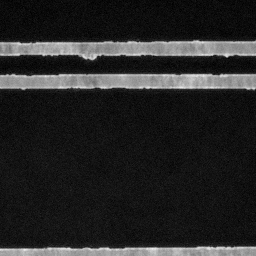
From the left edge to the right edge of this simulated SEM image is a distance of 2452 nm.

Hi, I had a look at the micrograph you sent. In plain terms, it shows lines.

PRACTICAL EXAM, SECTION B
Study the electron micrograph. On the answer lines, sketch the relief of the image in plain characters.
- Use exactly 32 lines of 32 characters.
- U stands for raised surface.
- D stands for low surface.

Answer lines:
DDDDDDDDDDDDDDDDDDDDDDDDDDDDDDDD
DDDDDDDDDDDDDDDDDDDDDDDDDDDDDDDD
DDDDDDDDDDDDDDDDDDDDDDDDDDDDDDDD
DDDDDDDDDDDDDDDDDDDDDDDDDDDDDDDD
DDDDDDDDDDDDDDDDDDDDDDDDDDDDDDDD
UUUUUUUUUUUUUUUUUUUUUUUUUUUUUUUU
UUUUUUUUUUUUUUUUUUUUUUUUUUUUUUUU
DDDDDDDDDDDDDDDDDDDDDDDDDDDDDDDD
DDDDDDDDDDDDDDDDDDDDDDDDDDDDDDDD
UUUUUUUUUUUUUUUUUUUUUUUUUUUUUUUU
UUUUUUUUUUUUUUUUUUUUUUUUUUUUUUUU
DDDDDDDDDDDDDDDDDDDDDDDDDDDDDDDD
DDDDDDDDDDDDDDDDDDDDDDDDDDDDDDDD
DDDDDDDDDDDDDDDDDDDDDDDDDDDDDDDD
DDDDDDDDDDDDDDDDDDDDDDDDDDDDDDDD
DDDDDDDDDDDDDDDDDDDDDDDDDDDDDDDD
DDDDDDDDDDDDDDDDDDDDDDDDDDDDDDDD
DDDDDDDDDDDDDDDDDDDDDDDDDDDDDDDD
DDDDDDDDDDDDDDDDDDDDDDDDDDDDDDDD
DDDDDDDDDDDDDDDDDDDDDDDDDDDDDDDD
DDDDDDDDDDDDDDDDDDDDDDDDDDDDDDDD
DDDDDDDDDDDDDDDDDDDDDDDDDDDDDDDD
DDDDDDDDDDDDDDDDDDDDDDDDDDDDDDDD
DDDDDDDDDDDDDDDDDDDDDDDDDDDDDDDD
DDDDDDDDDDDDDDDDDDDDDDDDDDDDDDDD
DDDDDDDDDDDDDDDDDDDDDDDDDDDDDDDD
DDDDDDDDDDDDDDDDDDDDDDDDDDDDDDDD
DDDDDDDDDDDDDDDDDDDDDDDDDDDDDDDD
DDDDDDDDDDDDDDDDDDDDDDDDDDDDDDDD
DDDDDDDDDDDDDDDDDDDDDDDDDDDDDDDD
DDDDDDDDDDDDDDDDDDDDDDDDDDDDDDDD
UUUUUUUUUUUUUUUUUUUUUUUUUUUUUUUU